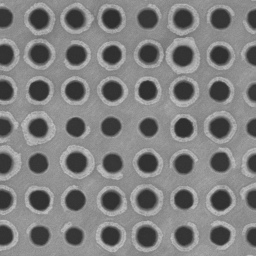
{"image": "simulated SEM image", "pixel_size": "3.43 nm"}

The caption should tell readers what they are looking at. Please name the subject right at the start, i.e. a regular array of holes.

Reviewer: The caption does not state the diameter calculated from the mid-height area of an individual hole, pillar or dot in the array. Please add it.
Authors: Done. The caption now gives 0.07 microns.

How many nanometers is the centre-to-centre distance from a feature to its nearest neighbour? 121